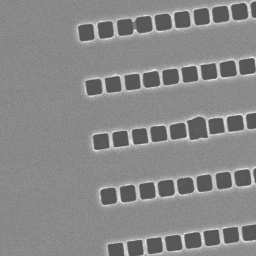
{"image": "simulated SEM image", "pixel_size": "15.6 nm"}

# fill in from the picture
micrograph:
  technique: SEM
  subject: a regular array of holes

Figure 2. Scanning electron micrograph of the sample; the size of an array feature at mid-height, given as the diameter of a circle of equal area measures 281 nm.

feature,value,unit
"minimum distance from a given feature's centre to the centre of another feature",19.1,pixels